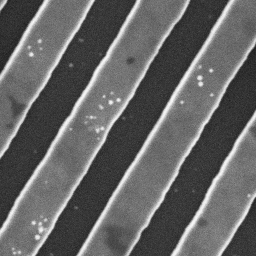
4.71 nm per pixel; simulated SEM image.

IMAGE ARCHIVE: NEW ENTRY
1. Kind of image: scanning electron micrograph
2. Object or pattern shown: lines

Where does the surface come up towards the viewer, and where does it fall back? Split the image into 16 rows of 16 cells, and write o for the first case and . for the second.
...ooo..oooo..oo
..ooo...ooo..ooo
.ooo...ooo...ooo
.ooo...ooo..ooo.
ooo...ooo...ooo.
ooo..oooo..ooo..
oo...ooo..oooo..
o...ooo...ooo...
o...ooo..ooo...o
...ooo...ooo..oo
..oooo..ooo...oo
..ooo..oooo..ooo
.ooo...ooo...ooo
.ooo..oooo..ooo.
ooo...ooo...ooo.
oo...ooo...ooo..